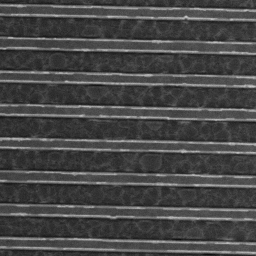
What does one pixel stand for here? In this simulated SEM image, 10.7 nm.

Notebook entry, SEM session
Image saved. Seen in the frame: parallel lines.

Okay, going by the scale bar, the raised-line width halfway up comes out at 0.119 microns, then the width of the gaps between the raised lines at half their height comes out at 0.237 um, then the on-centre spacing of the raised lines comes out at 0.355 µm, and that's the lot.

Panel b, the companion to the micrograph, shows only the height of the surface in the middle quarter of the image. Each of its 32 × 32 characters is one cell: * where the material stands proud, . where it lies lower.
................................
................................
**************..................
********************************
********************************
................................
................................
................................
................................
................................
................................
********************************
********************************
.....................***********
................................
................................
................................
................................
................................
******************************..
********************************
......**************************
................................
................................
................................
................................
................................
****************................
********************************
********************************
................................
................................